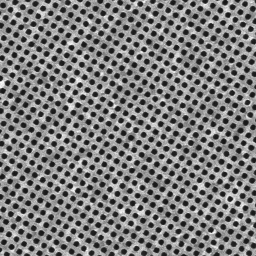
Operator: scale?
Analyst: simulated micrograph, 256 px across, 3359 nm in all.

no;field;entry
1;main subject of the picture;a regular array of holes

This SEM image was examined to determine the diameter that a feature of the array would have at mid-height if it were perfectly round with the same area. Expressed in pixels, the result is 6.08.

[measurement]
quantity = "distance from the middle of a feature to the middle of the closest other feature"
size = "8.83 pixels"